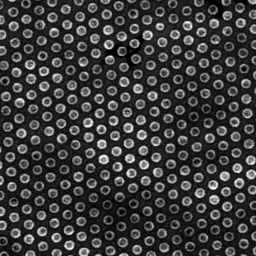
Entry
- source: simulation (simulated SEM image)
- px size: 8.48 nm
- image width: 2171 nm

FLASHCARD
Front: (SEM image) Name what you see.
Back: a regular array of raised bodies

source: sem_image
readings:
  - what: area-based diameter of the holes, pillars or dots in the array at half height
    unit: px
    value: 8.51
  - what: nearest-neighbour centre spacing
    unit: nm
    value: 124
